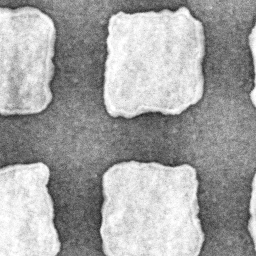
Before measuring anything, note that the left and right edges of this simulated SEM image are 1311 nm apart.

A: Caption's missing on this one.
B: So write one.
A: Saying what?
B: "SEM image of raised bodies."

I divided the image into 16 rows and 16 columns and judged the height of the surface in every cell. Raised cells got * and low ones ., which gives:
................
***....*****....
***....******...
***....******...
***....*****....
***....******...
***....*****....
................
................
................
.**....*****....
***....*****....
***....*****....
***...******....
***...*******...
****...******...